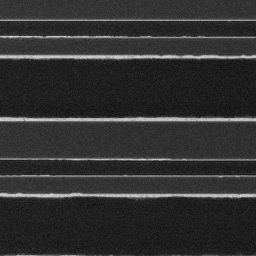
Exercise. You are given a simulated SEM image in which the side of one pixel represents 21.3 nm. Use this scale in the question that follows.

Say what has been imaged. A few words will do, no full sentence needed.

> lines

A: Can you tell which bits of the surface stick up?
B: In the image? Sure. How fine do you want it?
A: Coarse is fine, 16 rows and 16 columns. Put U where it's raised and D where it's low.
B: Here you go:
UUUUUUUUUUUUUUUU
UUUUUUUUUUUUUUUU
UUUUUUUUUUUUUUUU
UDUUDDDUUUUUUUUU
DDDDDDDDDDDDDDDD
DDDDDDDDDDDDDDDD
DDDDDDDDDDDDDDDD
DDDDDDDDDDDDDDDD
UUUUUUUUUUUUUUUU
UUUUUUUUUUUUUUUU
UUUUUUUUUUUUUUUU
UUUUUUUUUUUUUUUU
DDDDDDDDDDDDDDDD
DDDDDDDDDDDDDDDD
DDDDDDDDDDDDDDDD
DDDDDDDDDDDDDDDD